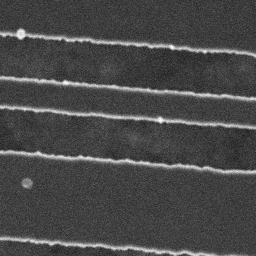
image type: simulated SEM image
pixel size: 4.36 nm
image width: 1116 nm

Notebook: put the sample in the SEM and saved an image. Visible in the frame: lines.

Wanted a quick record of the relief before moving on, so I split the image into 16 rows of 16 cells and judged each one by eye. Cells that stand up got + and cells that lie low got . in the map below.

++++++++++++++++
++++++++++++++++
....++++++++++++
................
................
++++++++........
++++++++++++++++
.........+++++++
................
+...............
+++++++++++++...
++++++++++++++++
++++++++++++++++
++++++++++++++++
++++++++++++++++
.......+++++++++